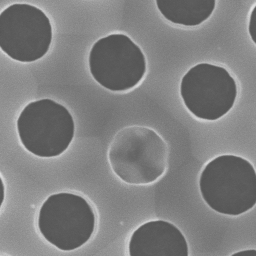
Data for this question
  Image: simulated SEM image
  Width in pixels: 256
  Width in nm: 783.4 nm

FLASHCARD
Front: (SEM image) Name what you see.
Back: holes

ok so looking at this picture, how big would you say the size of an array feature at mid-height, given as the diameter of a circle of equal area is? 170 nm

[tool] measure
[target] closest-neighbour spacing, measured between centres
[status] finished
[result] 292 nanometres